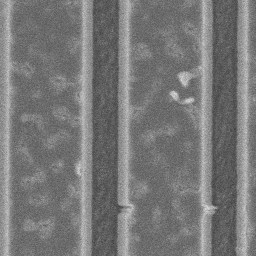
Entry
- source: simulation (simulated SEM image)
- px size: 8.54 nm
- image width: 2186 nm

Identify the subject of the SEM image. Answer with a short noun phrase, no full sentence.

one or a few lines or trenches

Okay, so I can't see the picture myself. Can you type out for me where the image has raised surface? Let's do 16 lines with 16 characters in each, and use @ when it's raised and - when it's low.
@@@@@---@@@@@--@
@@@@@---@@@@@--@
@@@@@---@@@@@--@
@@@@@---@@@@@--@
@@@@@---@@@@@--@
@@@@@---@@@@@--@
@@@@@---@@@@@--@
@@@@@---@@@@@--@
@@@@@---@@@@@--@
@@@@@---@@@@@--@
@@@@@---@@@@@--@
@@@@@---@@@@@--@
@@@@@---@@@@@--@
@@@@@---@@@@@--@
@@@@@---@@@@@--@
@@@@@---@@@@@--@